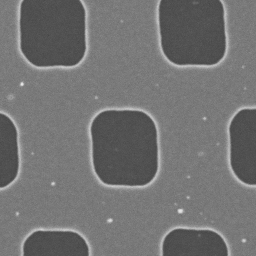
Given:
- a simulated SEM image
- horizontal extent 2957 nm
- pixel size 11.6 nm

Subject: holes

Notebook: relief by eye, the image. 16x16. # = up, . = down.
#....#####....##
#....#####....##
#....#####....##
##...#####....##
################
################
################
.#####...######.
.#####....####..
.#####....####..
.#####....#####.
.######..#######
################
################
##...######..###
#.....####....##